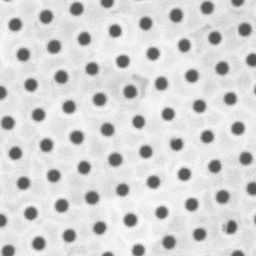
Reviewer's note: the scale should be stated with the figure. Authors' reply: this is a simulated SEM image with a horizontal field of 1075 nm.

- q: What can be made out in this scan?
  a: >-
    a regular array of holes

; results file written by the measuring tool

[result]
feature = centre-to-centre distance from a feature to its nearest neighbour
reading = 0.131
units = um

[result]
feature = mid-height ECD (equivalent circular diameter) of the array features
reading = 0.0579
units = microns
